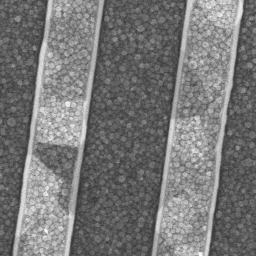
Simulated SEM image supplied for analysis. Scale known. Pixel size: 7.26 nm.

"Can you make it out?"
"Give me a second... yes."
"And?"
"one or a few lines or trenches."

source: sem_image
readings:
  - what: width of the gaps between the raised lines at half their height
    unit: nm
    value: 620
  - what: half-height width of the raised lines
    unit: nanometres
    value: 378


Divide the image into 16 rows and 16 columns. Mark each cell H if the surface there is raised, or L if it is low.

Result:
LLLHHHLLLLLLHHHL
LLLHHHLLLLLLHHHL
LLLHHHLLLLLHHHHL
LLLHHHLLLLLHHHHL
LLHHHHLLLLLHHHHL
LLHHHHLLLLLHHHLL
LLHHHLLLLLLHHHLL
LLHHHLLLLLLHHHLL
LLHHHLLLLLLHHHLL
LLHHHLLLLLLHHHLL
LLHHHLLLLLHHHHLL
LLHHHLLLLLHHHHLL
LHHHHLLLLLHHHLLL
LHHHHLLLLLHHHLLL
LHHHLLLLLLHHHLLL
LHHHLLLLLLHHHLLL